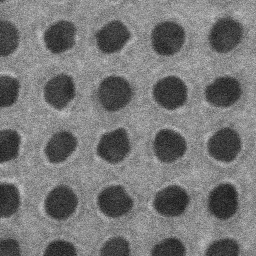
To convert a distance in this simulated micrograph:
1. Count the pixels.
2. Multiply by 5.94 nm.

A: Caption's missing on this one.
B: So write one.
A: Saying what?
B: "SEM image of a regular array of raised bodies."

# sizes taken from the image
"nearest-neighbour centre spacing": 53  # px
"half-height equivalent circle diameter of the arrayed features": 0.227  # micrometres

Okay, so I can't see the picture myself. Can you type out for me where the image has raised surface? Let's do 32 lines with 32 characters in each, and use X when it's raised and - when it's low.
--------------------------------
--------------------------------
X------XX-----X-----X------XXX--
XX----XXXX--XXXX---XXXX---XXXX--
XXX--XXXXX--XXXXX--XXXX---XXXX--
XXX--XXXXX--XXXX---XXXX---XXXX--
XX----XX----XXX----XXXX----XX---
--------------------------------
--------------------------------
XX----XXX----XX-----XX-----XX---
XXX--XXXXX--XXXX---XXXX---XXXX--
XXX--XXXXX--XXXXX--XXXXX-XXXXX--
XX---XXXX---XXXX---XXXXX-XXXXX--
X-----XX-----XXX----XXX----XX---
--------------------------------
--------------------------------
XX-----XX----XXX---XXXX----XXX--
XXX---XXXX--XXXX---XXXX---XXXX--
XXX--XXXXX--XXXXX--XXXX---XXXX--
XX---XXXX---XXXX---XXXX---XXXX--
------XX-----XX-----XX------X---
--------------------------------
--------------------------------
XX----XXX----XXX----XXX---XXXX--
XXX---XXXX--XXXXX--XXXXX--XXXX--
XXX--XXXXX--XXXXX--XXXXX--XXXX--
XX---XXXXX--XXXX---XXXX---XXXX--
X-----XXX------------------XX---
--------------------------------
--------------XX-----X----------
XXX---XXX----XXX---XXXX---XXXX--
XXX--XXXXX--XXXX---XXXX--XXXXX--